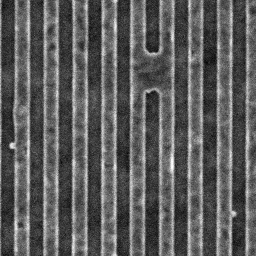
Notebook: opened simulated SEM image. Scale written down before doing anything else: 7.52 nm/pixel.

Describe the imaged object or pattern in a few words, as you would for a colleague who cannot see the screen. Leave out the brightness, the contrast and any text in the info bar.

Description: parallel lines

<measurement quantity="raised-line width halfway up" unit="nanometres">105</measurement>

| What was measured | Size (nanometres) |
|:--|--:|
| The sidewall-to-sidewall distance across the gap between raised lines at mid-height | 110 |